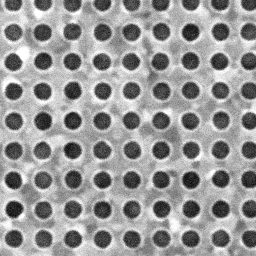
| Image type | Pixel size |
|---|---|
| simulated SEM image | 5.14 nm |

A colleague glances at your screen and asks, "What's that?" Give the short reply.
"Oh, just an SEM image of a regular array of holes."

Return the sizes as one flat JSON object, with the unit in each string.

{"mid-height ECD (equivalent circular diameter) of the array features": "101 nanometers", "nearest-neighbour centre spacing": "150 nanometers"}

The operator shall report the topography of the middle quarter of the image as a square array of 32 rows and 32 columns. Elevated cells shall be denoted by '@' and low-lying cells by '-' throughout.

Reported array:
----@@@-----@@-----@@@----@@@---
@--@@@@@---@@@@---@@@@@---@@@@--
@@@@@@@@@@@@@@@@@@@@@@@@@@@@@@@@
@@@@@@@@@@@@@@@@@@@@@@@@@@@@@@@@
@---@@@@@-@@@@@@--@@@@@@--@@@@--
----@@@-----@@@----@@@----@@@---
-----@@-----@@-----@@@-----@@---
-----@@-----@@-----@@@-----@@---
@---@@@@----@@@---@@@@@---@@@@--
@@@@@@@@@@@@@@@@@@@@@@@@@@@@@@@@
@@@@@@@@@@@@@@@@@@@@@@@@@@@@@@@@
@@@@@@@@@@@@@@@@@@@@@@@@@@@@@@@@
----@@@@---@@@@----@@@----@@@@--
-----@@-----@@-----@@@-----@@---
-----@@-----@@-----@@@-----@@---
----@@@-----@@@----@@@----@@@---
@--@@@@@---@@@@@-@@@@@@--@@@@@@-
@@@@@@@@@@@@@@@@@@@@@@@@@@@@@@@@
@@@@@@@@@@@@@@@@@@@@@@@@@@@@@@@@
@--@@@@@@--@@@@@---@@@@---@@@@--
----@@@-----@@@----@@@-----@@@--
-----@@-----@@@-----@@-----@@---
-----@@-----@@@-----@@-----@@@--
----@@@@---@@@@@---@@@----@@@@--
@@@@@@@@@@@@@@@@@@@@@@@@@@@@@@@@
@@@@@@@@@@@@@@@@@@@@@@@@@@@@@@@@
@@-@@@@@@@@@@@@@@@@@@@@-@@@@@@@@
----@@@@----@@@----@@@----@@@@--
-----@@-----@@@----@@@-----@@---
-----@@-----@@@----@@@-----@@---
----@@@@----@@@----@@@----@@@@--
@@@@@@@@@-@@@@@@-@@@@@@@-@@@@@@-